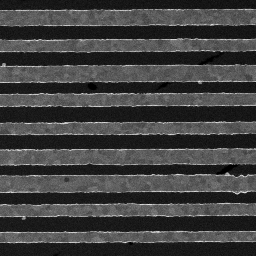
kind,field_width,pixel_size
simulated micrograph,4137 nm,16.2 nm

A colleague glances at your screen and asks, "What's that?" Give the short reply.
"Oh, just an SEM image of parallel lines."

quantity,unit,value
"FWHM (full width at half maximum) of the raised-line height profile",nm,206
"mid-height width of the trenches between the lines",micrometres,0.23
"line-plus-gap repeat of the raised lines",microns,0.443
